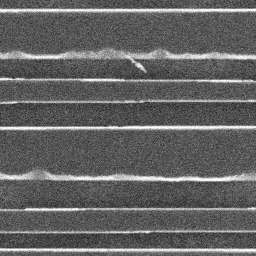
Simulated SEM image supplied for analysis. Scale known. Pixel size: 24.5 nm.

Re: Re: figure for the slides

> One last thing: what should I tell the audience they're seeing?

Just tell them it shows lines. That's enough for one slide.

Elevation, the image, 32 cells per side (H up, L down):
LLLLLLLLLLLLLLLLLLLLLLLLLLLLLLLL
HHHHHHHHHHHHHHHHHHHHHHHHHHHHHHHH
HHHHHHHHHHHHHHHHHHHHHHHHHHHHHHHH
HHHHHHHHHHHHHHHHHHHHHHHHHHHHHHHH
HHHHHHHHHHHHHHHHHHHHHHHHHHHHHHHH
HHHHHHHHHHHHHHHHHHHHHHHHHHHHHHHH
HHHHHHHHHHHHHHHHHHHHHHHHHHHHHHHH
LLLLLLLLLLLLLLLLLLLLLLLLLLLLLLLL
LLLLLLLLLLLLLLLLLLLLLLLLLLLLLLLL
LLLLLLLLLLLLLLLLLLLLLLLLLLLLLLLL
HHHHHHHHHHHHHHHHHHHHHHHHHHHHHHHH
HHHHHHHHHHHHHHHHHHHHHHHHHHHHHHHH
HHHHHHHHHHHHHHHHHHHHHHHHHHHHHHHH
LLLLLLLLLLLLLLLLLLLLLLLLLLLLLLLL
LLLLLLLLLLLLLLLLLLLLLLLLLLLLLLLL
LLLLLLLLLLLLLLLLLLLLLLLLLLLLLLLL
HHHHHHHHHHHHHHHHHHHHHHHHHHHHHHHH
HHHHHHHHHHHHHHHHHHHHHHHHHHHHHHHH
HHHHHHHHHHHHHHHHHHHHHHHHHHHHHHHH
HHHHHHHHHHHHHHHHHHHHHHHHHHHHHHHH
HHHHHHHHHHHHHHHHHHHHHHHHHHHHHHHH
HHHHHHHHHHHHHHHHHHHHHHHHHHHHHHHH
LLLLLLLLLLLLLLLLLLLLLLLLLLLLLLLL
LLLLLLLLLLLLLLLLLLLLLLLLLLLLLLLL
LLLLLLLLLLLLLLLLLLLLLLLLLLLLLLLL
LLLLLLLLLLLLLLLLLLLLLLLLLLLLLLLL
HHHHHHHHHHHHHHHHHHHHHHHHHHHHHHHH
HHHHHHHHHHHHHHHHHHHHHHHHHHHHHHHH
HHHHHHHHHHHHHHHHHHHHHHHHHHHHHHHH
LLLLLLLLLLLLLLLLLLLLLLLLLLLLLLLL
LLLLLLLLLLLLLLLLLLLLLLLLLLLLLLLL
HHHHHHHHHHHHHHHHHHHHHHHHHHHHHHHH